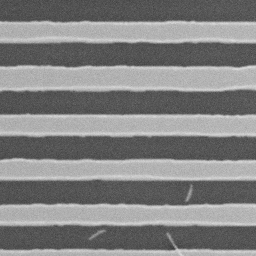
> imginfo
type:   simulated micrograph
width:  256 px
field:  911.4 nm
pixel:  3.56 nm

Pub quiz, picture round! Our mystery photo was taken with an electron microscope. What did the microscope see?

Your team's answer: lines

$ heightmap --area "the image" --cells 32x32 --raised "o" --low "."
................................
................................
................................
oooooooooooooooooooooooooooooooo
oooooooooooooooooooooooooooooooo
................................
................................
................................
oooooooooooooooooooooooooooooooo
oooooooooooooooooooooooooooooooo
oooooooooooooooooooooooooooooooo
................................
................................
................................
oooooooooooooooooooooooooooo.ooo
oooooooooooooooooooooooooooooooo
oooooooooooooooooooooooooooooooo
................................
................................
................................
oooooooooooooooooooooooooooooooo
oooooooooooooooooooooooooooooooo
......................ooo.......
................................
................................
................................
oooooooooooooooooooooooooooooooo
oooooooooooooooooooooooooooooooo
................................
................................
................................
oooooooooooooooooooooooooooooooo